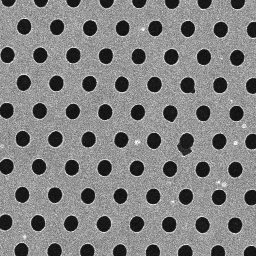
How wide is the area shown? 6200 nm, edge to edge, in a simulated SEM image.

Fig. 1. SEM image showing a regular array of holes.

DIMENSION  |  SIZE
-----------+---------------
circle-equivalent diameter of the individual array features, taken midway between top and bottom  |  0.367 microns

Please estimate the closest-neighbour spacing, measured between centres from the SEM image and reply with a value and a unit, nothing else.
779 nanometers